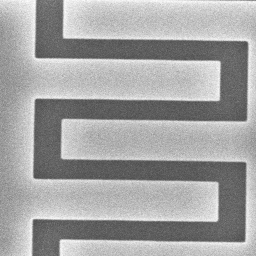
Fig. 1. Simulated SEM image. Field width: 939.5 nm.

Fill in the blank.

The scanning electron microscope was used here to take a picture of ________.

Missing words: groups of lines, slits or small figures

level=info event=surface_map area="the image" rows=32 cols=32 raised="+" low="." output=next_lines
++++....++++++++++++++++++++++++
++++....++++++++++++++++++++++++
++++....++++++++++++++++++++++++
++++....++++++++++++++++++++++++
++++....++++++++++++++++++++++++
++++...........................+
++++...........................+
++++++++++++++++...............+
++++++++++++++++++++++++++++...+
++++++++++++++++++++++++++++...+
+++++++++++++++++++++++++++....+
+++++++++++++++++++++++++++....+
+++++.................+++++....+
++++...........................+
++++...........................+
++++....++++++++++++++++++++++++
++++....++++++++++++++++++++++++
++++....++++++++++++++++++++++++
++++....++++++++++++++++++++++++
++++....++++++++++++++++++++++++
++++...........................+
++++...........................+
+++++++........................+
+++++++++++++++++++++++++++....+
+++++++++++++++++++++++++++....+
+++++++++++++++++++++++++++....+
+++++++++++++++++++++++++++....+
++++............+++++++++++....+
++++...........................+
++++...........................+
++++....++++++++++++++++++++++++
++++....++++++++++++++++++++++++